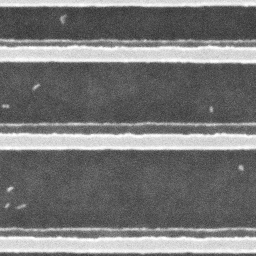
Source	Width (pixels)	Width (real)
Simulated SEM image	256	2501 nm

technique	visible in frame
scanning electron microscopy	lines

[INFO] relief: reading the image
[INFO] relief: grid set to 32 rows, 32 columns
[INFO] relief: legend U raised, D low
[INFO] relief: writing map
UUUUUUUUUUUUUUUUUUUUUUUUUUUUUUUU
DDDDDDDDDDDDDDDDDDDDDDDDDDDDDDDD
DDDDDDDDDDDDDDDDDDDDDDDDDDDDDDDD
DDDDDDDDDDDDDDDDDDDDDDDDDDDDDDDD
DDDDDDDDDDDDDDDDDDDDDDDDDDDDDDDD
UUUUUUUUUUUUUUUUUUUUUUUUUUUUUUUU
UUUUUUUUUUUUUUUUUUUUUUUUUUUUUUUU
UUUUUUUUUUUUUUUUUUUUUUUUUUUUUUUU
DDDDDDDDDDDDDDDDDDDDDDDDDDDDDDDD
DDDDDDDDDDDDDDDDDDDDDDDDDDDDDDDD
DDDDDDDDDDDDDDDDDDDDDDDDDDDDDDDD
DDDDDDDDDDDDDDDDDDDDDDDDDDDDDDDD
DDDDDDDDDDDDDDDDDDDDDDDDDDDDDDDD
DDDDDDDDDDDDDDDDDDDDDDDDDDDDDDDD
DDDDDDDDDDDDDDDDDDDDDDDDDDDDDDDD
DDDDDDDDDUDUDDDDDUUUUUDDDDDDDDDD
UUUUUUUUUUUUUUUUUUUUUUUUUUUUUUUU
UUUUUUUUUUUUUUUUUUUUUUUUUUUUUUUU
UUUUUUUUUUUUUUUUUUUUUUUUUUUUUUUU
DDDDDDDDDDDDDDDDDDDDDDDDDDDDDDDD
DDDDDDDDDDDDDDDDDDDDDDDDDDDDDDDD
DDDDDDDDDDDDDDDDDDDDDDDDDDDDDDDD
DDDDDDDDDDDDDDDDDDDDDDDDDDDDDDDD
DDDDDDDDDDDDDDDDDDDDDDDDDDDDDDDD
DDDDDDDDDDDDDDDDDDDDDDDDDDDDDDDD
DDDDDDDDDDDDDDDDDDDDDDDDDDDDDDDD
DDDDDDDDDDDDDDDDDDDDDDDDDDDDDDDD
DDDDDDDDDDDDDDDDDDDDDDDDDDDDDDDD
DDDDDDDDDDDDDDDDDDDDDDDDDDDDDDDD
UUUUUUUUUUUUUUUUUUUUUUUUUUUUUUUU
UUUUUUUUUUUUUUUUUUUUUUUUUUUUUUUU
DDDDDDDDDUUUUUUUUUUUUUUDUUUUUUUU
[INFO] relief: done